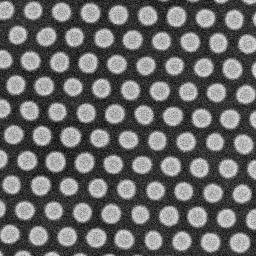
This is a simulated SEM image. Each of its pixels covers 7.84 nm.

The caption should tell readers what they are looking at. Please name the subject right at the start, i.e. an array of small figures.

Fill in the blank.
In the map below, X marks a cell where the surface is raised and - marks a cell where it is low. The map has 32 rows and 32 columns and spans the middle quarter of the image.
X---XXXX---XXXX---XXXX----XXXX--
-----XX-----XXX----XXX----XXX---
---------------------------X----
--------------------------------
-XXX----XXX---------------------
XXXX---XXXX----XXX----XXXX----XX
XXXX---XXXX----XXXX---XXXX---XXX
-XX-----XXX----XXX----XXXX---XXX
----------------XX-----XX-----XX
--------------------------------
-----XX-----XX------------------
----XXX----XXXX---XXXX----XXX---
----XXX----XXXX---XXXX---XXXX---
----XXX----XXXX---XXXX---XXXX---
------------X------XX-----XXX---
--------------------------------
XXX-----------------------------
XXXX---XXXX----XXX----XX------X-
XXXX---XXXX---XXXX---XXXX----XXX
XXX----XXXX---XXXX---XXXX---XXXX
-X-------------XXX----XXX----XXX
--------------------------------
--------------------------------
----XXX----XX------X------------
---XXXX---XXXX----XXXX---XXXX---
---XXXX---XXXX---XXXXX---XXXX---
----XX-----XXX----XXX----XXXX---
--------------------------XX----
--------------------------------
XXX----XXX-----XX---------------
XXX----XXX----XXX----XXX----XXX-
XXX----XXX----XXX----XXXX---XXXX